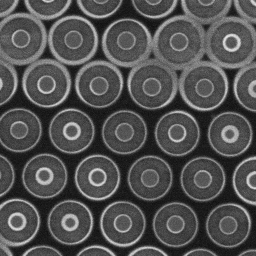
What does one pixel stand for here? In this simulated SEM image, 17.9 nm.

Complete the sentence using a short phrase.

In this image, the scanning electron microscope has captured an array of small figures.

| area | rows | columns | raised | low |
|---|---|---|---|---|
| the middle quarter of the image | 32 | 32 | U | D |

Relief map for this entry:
UUUUUUDDDDDDUUUUUUUDDDDDDUUUDUUU
UUUUUDDDDDDDDUUUUUDDDDDDDDUUUUUD
UUUUDDDDDDDDDDUUUDDDDDDDDDDUUUDD
DUUUDDDDUDDDDDUUUDDDDDDDDDDUUUDD
DUUDDDDUUUUDDDUUDDDDUUUUDDDDUUDD
DUUDDDDUUUUDDDUUDDDDUUUUDDDDUDDD
DUUDDDDUUUUDDDUUDDDDUUUUDDDDUUDD
DUUUDDDDUUDDDDUUUDDDDUUDDDDUUUDD
UUUUDDDDDDDDDUUUUDDDDDDDDDDUUUDD
UUUUUDDDDDDDUUUUUUDDDDDDDDUUUUUD
UUUUUUUUDDUUUUUUUUUUDDDDUUUUUUUU
UDUUUUUUUUUUUUUUUUUUUUUUUUUUUUUU
DDDDDUUUUUUUUDDDDDUUUUUUUUDDDDUU
DDDDDDUUUUUUDDDDDDDUUUUUUDDDDDDD
DDDDDDDUUUUDDDDDDDDDUUUUDDDDDDDD
DUUDDDDUUUDDDDUUUDDDUUUDDDDUUDDD
UUUUDDDUUUDDDUUUUDDDUUUDDDUUUUDD
UUUUDDDUUUDDDUUUUDDDUUUDDDUUUUDD
DUUDDDDUUUDDDUUUUDDDUUUDDDDUUUDD
DDDDDDUUUUDDDDDDDDDDUUUUDDDDDDDD
DDDDDDUUUUUDDDDDDDDUUUUUDDDDDDDD
DDDDUUUUUUUUDDDDDDUUUUUUUDDDDDDD
UUUUUUUUUUUUUUUUUUUUUUUUUUUDDDUU
UUUUUUDDDDDUUUUUUUUUDDDUUUUUUUUU
UUUUUDDDDDDDUUUUUUDDDDDDDUUUUUUU
UUUUDDDDDDDDDUUUUDDDDDDDDDUUUUUD
UUUDDDDUUDDDDUUUUDDDDDDDDDUUUUDD
UUUDDDDUUUDDDDUUDDDDUUUDDDDUUUDD
UUUDDDUUUUDDDDUUDDDDUUUUDDDUUDDD
UUUDDDDUUUDDDDUUDDDDUUUDDDDUUDDD
UUUUDDDDDDDDDUUUUDDDDUDDDDUUUUDD
UUUUDDDDDDDDDUUUUDDDDDDDDDUUUUDD